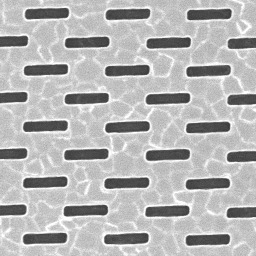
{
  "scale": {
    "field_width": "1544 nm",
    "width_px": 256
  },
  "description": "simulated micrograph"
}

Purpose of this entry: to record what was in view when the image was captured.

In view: a regular array of holes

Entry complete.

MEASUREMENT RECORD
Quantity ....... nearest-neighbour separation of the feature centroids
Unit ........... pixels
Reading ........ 49.5